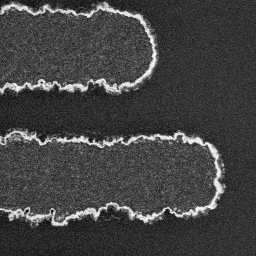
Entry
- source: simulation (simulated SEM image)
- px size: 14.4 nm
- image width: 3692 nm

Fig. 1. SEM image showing one or a few lines or trenches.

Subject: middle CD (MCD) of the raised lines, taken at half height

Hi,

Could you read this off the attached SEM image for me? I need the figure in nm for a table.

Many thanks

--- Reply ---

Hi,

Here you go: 1090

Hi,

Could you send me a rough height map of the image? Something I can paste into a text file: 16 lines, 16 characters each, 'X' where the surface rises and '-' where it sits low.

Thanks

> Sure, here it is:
X---------------
XXXXXXXXX-------
XXXXXXXXXX------
XXXXXXXXXX------
XXXXXXXXX-------
----------------
----------------
----------------
-X--------------
XXXXXXXXXXXXX---
XXXXXXXXXXXXXX--
XXXXXXXXXXXXXX--
XXXXXXXXXXXXX---
--XXX----X------
----------------
----------------